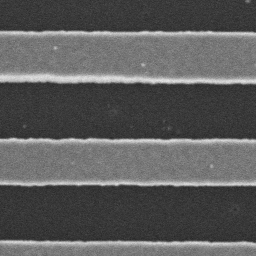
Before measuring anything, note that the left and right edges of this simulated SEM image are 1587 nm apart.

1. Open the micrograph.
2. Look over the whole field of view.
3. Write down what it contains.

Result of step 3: lines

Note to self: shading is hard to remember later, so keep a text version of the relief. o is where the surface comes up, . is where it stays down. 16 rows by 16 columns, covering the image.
................
................
oooooooooooooooo
oooooooooooooooo
oooooooooooooooo
................
................
................
................
oooooooooooooooo
oooooooooooooooo
oooooooooooooooo
................
................
................
oooooooooooooooo